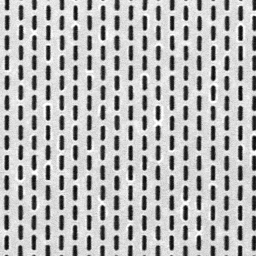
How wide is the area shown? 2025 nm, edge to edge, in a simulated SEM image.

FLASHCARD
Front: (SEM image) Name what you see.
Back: a regular array of holes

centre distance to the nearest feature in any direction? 0.131 um